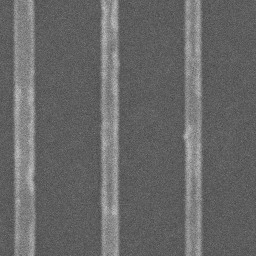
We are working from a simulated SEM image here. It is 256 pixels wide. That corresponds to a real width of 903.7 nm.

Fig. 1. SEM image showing one or a few lines or trenches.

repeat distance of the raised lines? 298 nm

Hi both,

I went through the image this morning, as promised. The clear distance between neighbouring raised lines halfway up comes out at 0.247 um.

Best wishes